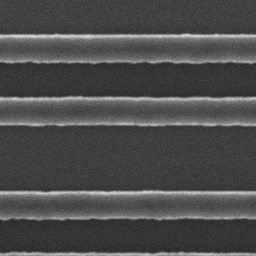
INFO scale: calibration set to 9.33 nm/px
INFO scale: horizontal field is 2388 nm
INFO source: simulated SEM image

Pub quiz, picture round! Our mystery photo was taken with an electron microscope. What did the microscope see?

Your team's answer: lines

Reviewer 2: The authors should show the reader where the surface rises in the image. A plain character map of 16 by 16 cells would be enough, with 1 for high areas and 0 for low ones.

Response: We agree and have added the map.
0000000000000000
0000000000000000
1111111111111111
1111111111111111
0000000000000000
0000000000000000
1111111111111111
1111111111111111
0000000000000000
0000000000000000
0000000000000000
0000000000000000
1111111111111111
1111111111111111
0000000000000000
0000000000000000